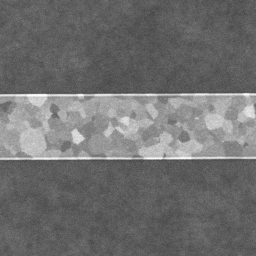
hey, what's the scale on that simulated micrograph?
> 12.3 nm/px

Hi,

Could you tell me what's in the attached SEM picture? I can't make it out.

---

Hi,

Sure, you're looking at one or a few lines or trenches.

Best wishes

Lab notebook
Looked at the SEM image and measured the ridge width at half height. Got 781 nanometers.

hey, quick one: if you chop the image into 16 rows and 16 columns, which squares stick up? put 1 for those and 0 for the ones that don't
0000000000000000
0000000000000000
0000000000000000
0000000000000000
0000000000000000
0000000000000000
1111111111111111
1111111111111111
1111111111111111
1111111111111111
0000000000000000
0000000000000000
0000000000000000
0000000000000000
0000000000000000
0000000000000000